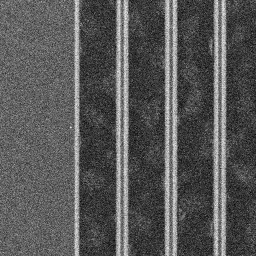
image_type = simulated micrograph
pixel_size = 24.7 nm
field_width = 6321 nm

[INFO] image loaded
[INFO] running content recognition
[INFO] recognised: parallel lines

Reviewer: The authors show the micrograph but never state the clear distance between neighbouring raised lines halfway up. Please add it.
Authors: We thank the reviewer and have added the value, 1020 nm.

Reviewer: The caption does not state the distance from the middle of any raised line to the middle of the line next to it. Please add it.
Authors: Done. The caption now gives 1210 nm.